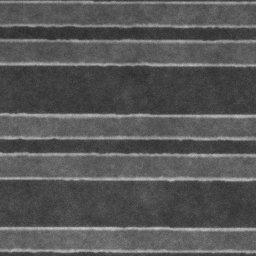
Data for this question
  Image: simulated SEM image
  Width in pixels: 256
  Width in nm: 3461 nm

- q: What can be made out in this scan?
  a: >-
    lines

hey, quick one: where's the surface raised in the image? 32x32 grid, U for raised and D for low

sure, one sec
UUUUUUUUUUUUUUUUUUUUUUUUUUUUUUUU
UUUUUUUUUUUUUUUUUUUUUUUUUUUUUUUU
UUUUUUUUUUUUUUUUUUUUUUUUUUUUUUUU
DDDDDDDDDDDDDDDDDDDDDDDDDDDDDDDD
DDDDDDDDDDDDDDDDDDDDDDDDDDDDDDDD
UUUUUUUUUUUUUUUUUUUUUUUUUUUUUUUU
UUUUUUUUUUUUUUUUUUUUUUUUUUUUUUUU
UUUUUUUUUUUUUUUUUUUUUUUUUUUUUUUU
DDDDDDDDDDDDDDDDDDDDDDDDDDDDDDDD
DDDDDDDDDDDDDDDDDDDDDDDDDDDDDDDD
DDDDDDDDDDDDDDDDDDDDDDDDDDDDDDDD
DDDDDDDDDDDDDDDDDDDDDDDDDDDDDDDD
DDDDDDDDDDDDDDDDDDDDDDDDDDDDDDDD
DDDDDDDDDDDDDDDDDDDDDDDDDDDDDDDD
UUUUUUUUUUUUUUUUUUUUUUUUUDDDDDDD
UUUUUUUUUUUUUUUUUUUUUUUUUUUUUUUU
UUUUUUUUUUUUUUUUUUUUUUUUUUUUUUUU
DDDDDDDDDDDDDDDDDDDDDDDDDDDDDDDD
DDDDDDDDDDDDDDDDDDDDDDDDDDDDDDDD
UUUUUUUUUUUUUUUUUUUUUUUUUUUUUUUU
UUUUUUUUUUUUUUUUUUUUUUUUUUUUUUUU
UUUUUUUUUUUUUUUUUUUUUUUUUUUUUUUU
DDDDDDDDDDDDDDDDDDDDDDDDDDDDDDDD
DDDDDDDDDDDDDDDDDDDDDDDDDDDDDDDD
DDDDDDDDDDDDDDDDDDDDDDDDDDDDDDDD
DDDDDDDDDDDDDDDDDDDDDDDDDDDDDDDD
DDDDDDDDDDDDDDDDDDDDDDDDDDDDDDDD
DDDDDDDDDDDDDDDDDDDDDDDDDDDDDDDD
UUUUUUUDDDDDDDDDDDDDDDDDDDDDDDDD
UUUUUUUUUUUUUUUUUUUUUUUUUUUUUUUU
UUUUUUUUUUUUUUUUUUUUUUUUUUUUUUUU
DDDDDDDUDDDDDDDUUUDUUUUUUUUUUUUU